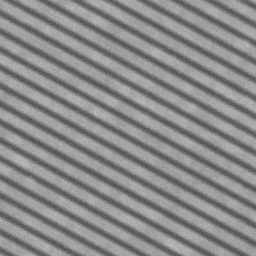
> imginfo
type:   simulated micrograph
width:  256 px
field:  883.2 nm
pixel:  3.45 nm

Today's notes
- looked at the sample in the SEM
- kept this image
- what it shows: parallel lines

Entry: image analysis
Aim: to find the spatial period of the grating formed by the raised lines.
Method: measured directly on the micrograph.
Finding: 55.1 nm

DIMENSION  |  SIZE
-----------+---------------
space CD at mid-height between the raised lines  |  25.3 nm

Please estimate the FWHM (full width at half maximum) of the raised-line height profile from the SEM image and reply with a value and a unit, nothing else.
28.4 nm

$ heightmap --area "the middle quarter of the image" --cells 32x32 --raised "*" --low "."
..****....****....*****....****.
....****....****....****.....***
*....*****....****....****.....*
***....****.....****....****....
.****....****.....****....****..
...****....****....*****....****
*....****....****....****....***
**....*****....****....****....*
****....****....****.....****...
..****....****....****.....****.
....****....****....****.....***
*.....****....****....****....**
***.....****....****....****....
.****....****....*****....****..
...****....****....****....****.
....*****....****....****....***
**....****.....****....****....*
****....****.....****....****...
..****....****....*****....****.
....****....****....****....****
*....*****....****....****....**
***....****....****.....****....
.****....****....****.....****..
..****.....****....****.....****
....****.....****....****....***
**....****.....****....****....*
****....****....****....*****...
..****....****....****....****..
...****.....****....****....****
*....****....****.....****....**
***....****....****.....****....
****.....****....****.....****..